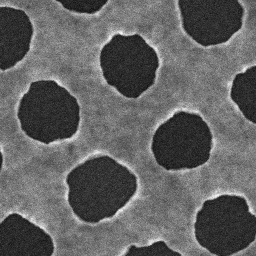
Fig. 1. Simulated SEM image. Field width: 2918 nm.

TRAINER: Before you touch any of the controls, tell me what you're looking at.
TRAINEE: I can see holes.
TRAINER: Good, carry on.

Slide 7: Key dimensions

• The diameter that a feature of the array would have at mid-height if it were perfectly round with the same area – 697 nm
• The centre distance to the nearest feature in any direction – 1.06 µm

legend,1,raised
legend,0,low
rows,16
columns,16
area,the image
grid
0111001111100001
0011111111100001
0011111001110011
0011110000111111
1111110000111110
1100111001111100
1000011111111110
1000011111000111
1100111111000111
1111111111000111
1111100011001111
1111000001111111
1111000011111001
1111100111110000
0001111111110000
0001111100011001